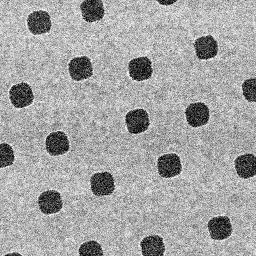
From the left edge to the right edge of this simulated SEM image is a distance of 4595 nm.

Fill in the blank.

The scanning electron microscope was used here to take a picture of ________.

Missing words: a regular array of holes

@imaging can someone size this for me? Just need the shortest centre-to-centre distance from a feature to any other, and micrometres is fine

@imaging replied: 1.05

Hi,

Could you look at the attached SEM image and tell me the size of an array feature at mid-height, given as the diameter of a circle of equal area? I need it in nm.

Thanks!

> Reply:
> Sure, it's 467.